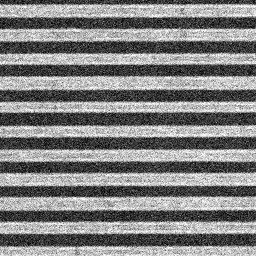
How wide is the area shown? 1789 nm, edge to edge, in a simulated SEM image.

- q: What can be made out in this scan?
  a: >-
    parallel lines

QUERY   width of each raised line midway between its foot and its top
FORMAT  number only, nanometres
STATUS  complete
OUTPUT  67.3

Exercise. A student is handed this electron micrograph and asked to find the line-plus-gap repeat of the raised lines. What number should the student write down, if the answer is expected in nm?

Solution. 168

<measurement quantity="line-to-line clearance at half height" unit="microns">0.104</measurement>